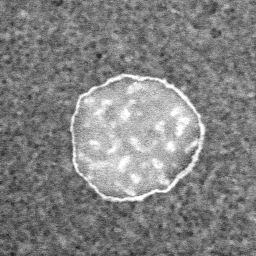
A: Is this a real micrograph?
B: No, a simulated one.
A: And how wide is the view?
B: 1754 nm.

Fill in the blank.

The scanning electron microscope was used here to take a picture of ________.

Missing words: holes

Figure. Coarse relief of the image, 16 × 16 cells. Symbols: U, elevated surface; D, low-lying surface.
UUUUUUUUUUUUUUUU
UUUUUUUUUUUUUUUU
UUUUUUUUUUUUUUUU
UUUUUUUUUUUUUUUU
UUUUUUUUUUUUUUUU
UUUUUUDDDDDUUUUU
UUUUUDDDDDDDUUUU
UUUUUDDDDDDDUUUU
UUUUUDDDDDDDDUUU
UUUUUDDDDDDDUUUU
UUUUUDDDDDDDUUUU
UUUUUUDDDDDUUUUU
UUUUUUUUUUUUUUUU
UUUUUUUUUUUUUUUU
UUUUUUUUUUUUUUUU
UUUUUUUUUUUUUUUU